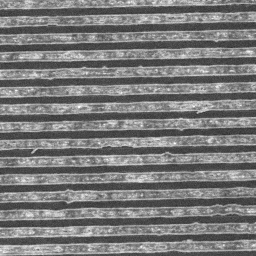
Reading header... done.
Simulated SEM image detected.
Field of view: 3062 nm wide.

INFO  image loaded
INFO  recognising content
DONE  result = parallel lines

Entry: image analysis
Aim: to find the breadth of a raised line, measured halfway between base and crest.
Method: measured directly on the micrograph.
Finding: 114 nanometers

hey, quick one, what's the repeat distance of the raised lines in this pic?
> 0.21 um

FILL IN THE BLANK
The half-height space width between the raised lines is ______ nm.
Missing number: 102